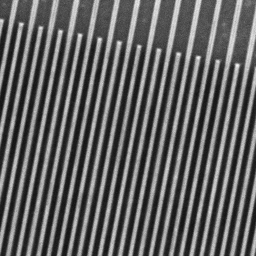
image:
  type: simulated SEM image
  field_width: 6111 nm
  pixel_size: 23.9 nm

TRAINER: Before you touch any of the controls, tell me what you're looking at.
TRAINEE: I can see parallel lines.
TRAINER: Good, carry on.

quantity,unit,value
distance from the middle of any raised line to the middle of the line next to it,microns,0.239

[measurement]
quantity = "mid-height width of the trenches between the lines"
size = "147 nanometers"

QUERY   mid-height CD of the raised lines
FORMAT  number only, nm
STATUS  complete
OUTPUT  82.1